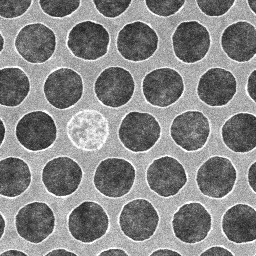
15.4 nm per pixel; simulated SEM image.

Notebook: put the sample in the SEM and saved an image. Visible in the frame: a regular array of holes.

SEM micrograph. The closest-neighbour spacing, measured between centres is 774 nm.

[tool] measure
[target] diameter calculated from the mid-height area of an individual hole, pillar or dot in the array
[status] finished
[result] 622 nm